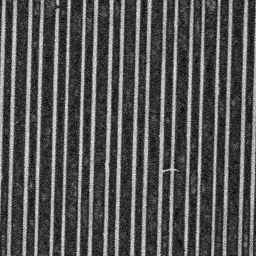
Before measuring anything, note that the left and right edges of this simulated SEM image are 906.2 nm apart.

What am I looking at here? parallel lines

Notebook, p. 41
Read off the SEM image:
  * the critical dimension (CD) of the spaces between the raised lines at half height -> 0.0305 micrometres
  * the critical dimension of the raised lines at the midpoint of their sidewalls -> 0.0119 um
